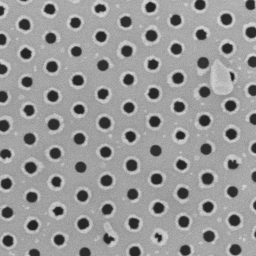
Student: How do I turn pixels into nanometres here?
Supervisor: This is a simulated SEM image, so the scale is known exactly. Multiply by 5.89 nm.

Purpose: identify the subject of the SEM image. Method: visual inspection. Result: a regular array of holes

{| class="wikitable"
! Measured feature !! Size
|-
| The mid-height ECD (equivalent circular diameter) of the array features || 65.8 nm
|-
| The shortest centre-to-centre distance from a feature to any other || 0.167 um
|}